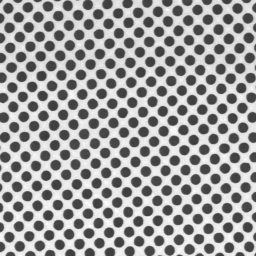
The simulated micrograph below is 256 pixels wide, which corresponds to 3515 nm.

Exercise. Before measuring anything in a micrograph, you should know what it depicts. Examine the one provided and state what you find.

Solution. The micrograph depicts a regular array of holes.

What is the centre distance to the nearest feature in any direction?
190 nm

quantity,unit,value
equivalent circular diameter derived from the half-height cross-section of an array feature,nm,143